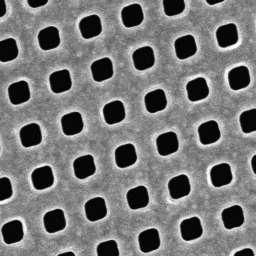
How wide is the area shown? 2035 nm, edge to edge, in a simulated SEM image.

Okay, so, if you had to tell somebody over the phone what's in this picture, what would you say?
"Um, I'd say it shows a regular array of holes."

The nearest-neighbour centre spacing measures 343 nm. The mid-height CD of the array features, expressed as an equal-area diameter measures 183 nm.